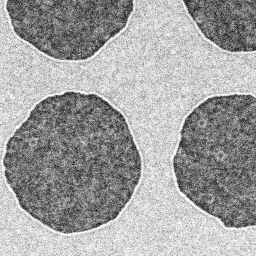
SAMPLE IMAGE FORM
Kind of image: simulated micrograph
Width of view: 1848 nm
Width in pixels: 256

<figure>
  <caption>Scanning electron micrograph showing holes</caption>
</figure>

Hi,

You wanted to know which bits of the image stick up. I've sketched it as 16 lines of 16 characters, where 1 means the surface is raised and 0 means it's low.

0000000011110000
1000000011110000
1000000111111000
1110001111111111
1111111111111111
1111111111111111
1100000111110000
1100000011110000
1000000011100000
0000000001100000
0000000001100000
0000000001100000
1000000011110000
1100000111111000
1110011111111111
1111111111111111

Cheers